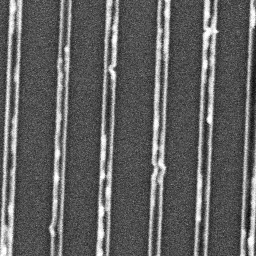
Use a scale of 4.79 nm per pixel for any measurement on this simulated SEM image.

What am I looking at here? parallel lines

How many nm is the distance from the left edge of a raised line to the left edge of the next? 232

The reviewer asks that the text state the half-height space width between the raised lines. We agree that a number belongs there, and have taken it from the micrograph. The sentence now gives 172 nm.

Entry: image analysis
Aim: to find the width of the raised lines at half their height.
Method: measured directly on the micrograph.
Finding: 49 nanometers